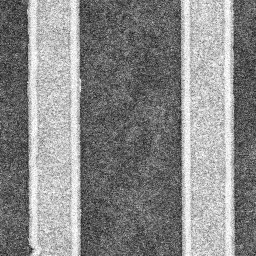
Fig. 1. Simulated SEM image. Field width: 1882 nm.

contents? one or a few lines or trenches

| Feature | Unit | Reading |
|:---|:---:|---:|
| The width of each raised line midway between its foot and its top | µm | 0.299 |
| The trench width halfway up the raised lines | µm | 0.833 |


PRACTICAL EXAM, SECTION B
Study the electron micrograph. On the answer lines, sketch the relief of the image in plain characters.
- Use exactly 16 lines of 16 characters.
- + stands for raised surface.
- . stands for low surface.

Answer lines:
..+++.......++..
..+++.......++..
..+++.......++..
..+++.......++..
..+++.......++..
..+++.......++..
..+++.......++..
..+++.......++..
..+++.......++..
..+++.......++..
..+++.......++..
..+++.......++..
..+++.......++..
..+++.......++..
..+++.......++..
..+++.......++..